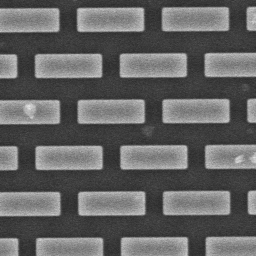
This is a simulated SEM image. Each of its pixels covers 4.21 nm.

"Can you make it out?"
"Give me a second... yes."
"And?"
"groups of lines, slits or small figures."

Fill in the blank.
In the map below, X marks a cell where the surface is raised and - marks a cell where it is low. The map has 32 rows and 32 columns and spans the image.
--------------------------------
XXXXXXX---XXXXXXXX--XXXXXXXXX--X
XXXXXXX---XXXXXXXX--XXXXXXXXX--X
XXXXXXX---XXXXXXXX--XXXXXXXX---X
--------------------------------
--------------------------------
--------------------------------
XX--XXXXXXXXX--XXXXXXXX---XXXXXX
XX--XXXXXXXXX--XXXXXXXX---XXXXXX
XX---XXXXXXX---XXXXXXXX---X-----
--------------------------------
--------------------------------
-------------------------XXX---X
XXXXXXX---XXXXXXXX--XXXXXXXXX--X
XXXXXXX---XXXXXXXX--XXXXXXXXX--X
--------------------------------
--------------------------------
--------------------------------
XX---XXXXXXXX--XXXXXXXX---XXXXXX
XX--XXXXXXXXX--XXXXXXXX---XXXXXX
XX--XXXXXXXXX--XXXXXXXX---XXXXXX
--------------------------------
--------------------------------
--------------------------------
XXXXXXX---XXXXXXXX--XXXXXXXXX--X
XXXXXXXX--XXXXXXXX--XXXXXXXXX--X
XXXXXXXX--XXXXXXXX--XXXXXXXXX--X
--------------------------------
--------------------------------
--------------------------------
XX---XXXXXXXX--XXXXXXXX---XXXXXX
XX---XXXXXXXX--XXXXXXXX---XXXXXX